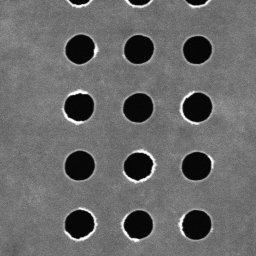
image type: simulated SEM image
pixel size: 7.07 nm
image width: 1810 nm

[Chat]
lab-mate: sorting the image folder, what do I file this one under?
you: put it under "a regular array of holes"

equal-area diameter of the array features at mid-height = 208 nm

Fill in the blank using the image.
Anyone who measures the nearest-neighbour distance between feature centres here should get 58.2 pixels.